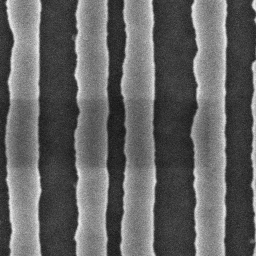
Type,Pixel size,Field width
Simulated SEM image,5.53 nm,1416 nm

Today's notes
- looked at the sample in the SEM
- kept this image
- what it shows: lines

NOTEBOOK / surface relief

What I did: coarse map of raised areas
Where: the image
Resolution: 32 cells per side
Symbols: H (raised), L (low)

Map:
LHHHHLLLLLHHHLLLHHHLLLLLHHHHLLLL
LHHHHLLLLLHHHLLHHHHLLLLLHHHHLLLL
LHHHHLLLLLHHHLLHHHHLLLLLHHHHLLLL
LHHHHLLLLLHHHLLLHHHLLLLLHHHHLLLL
LLHHHLLLLLHHHLLLHHHLLLLLLHHHLLLL
LLHHHLLLLHHHHLLLHHHLLLLLLHHHLLLL
LLHHHLLLLHHHHHLLHHHLLLLLLHHHLLLL
LHHHHLLLLLHHHHLLHHHLLLLLHHHHLLLL
LHHHHLLLLLHHHHLHHHHLLLLLHHHHLLLL
LHHHHLLLLHHHHHLHHHHLLLLLHHHHLLLL
LHHHHLLLLLHHHLLHHHHLLLLLLHHHLLLL
LHHHHLLLLLHHHLLHHHHLLLLLLHHHLLLL
LHHHHLLLLLHHHHLHHHHLLLLLLHHHLLLL
LHHHHLLLLLHHHHLLHHHLLLLLLHHHLLLH
LHHHHLLLLLHHHHLLHHHLLLLLHHHHLLLL
LHHHHLLLLLHHHLLLHHHLLLLLHHHHLLLL
LHHHHLLLLHHHHLLLHHHLLLLLHHHHLLLL
LHHHHLLLLHHHHLLLHHHLLLLLHHHHLLLL
LHHHHLLLLHHHHLLLHHHLLLLLHHHHLLLL
LHHHHLLLLHHHHLLLHHHLLLLLHHHHLLLH
LHHHHLLLLHHHHLLLHHHLLLLLHHHHLLLL
LHHHHLLLLLHHHLLLHHHLLLLLHHHHLLLL
LHHHHLLLLLHHHHLLHHHLLLLLHHHHLLLL
LHHHHLLLLLHHHHLHHHHLLLLLHHHHLLLL
LHHHHLLLLLHHHLLHHHHLLLLLLHHHLLLL
LHHHHLLLLLHHHLLHHHHLLLLLLHHHLLLL
LHHHHLLLLLHHHLLHHHHLLLLLHHHHLLLL
LHHHHLLLLLHHHLLHHHHLLLLLHHHHLLLL
LLHHHLLLLLHHHLLHHHHLLLLLHHHHLLLL
LHHHHLLLLHHHHLLHHHHLLLLLLHHHLLLL
LHHHHLLLLLHHHLLHHHHLLLLLHHHHLLLL
LHHHHLLLLLHHHLLHHHHLLLLLLHHHLLLL